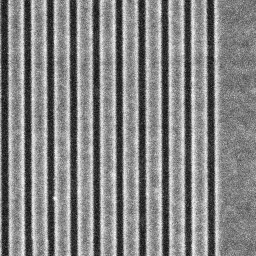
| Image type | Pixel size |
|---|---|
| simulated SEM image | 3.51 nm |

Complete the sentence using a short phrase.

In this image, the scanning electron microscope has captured parallel lines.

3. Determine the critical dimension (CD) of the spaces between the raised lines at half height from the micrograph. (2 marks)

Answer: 0.0294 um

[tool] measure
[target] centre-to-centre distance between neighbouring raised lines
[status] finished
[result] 80.5 nm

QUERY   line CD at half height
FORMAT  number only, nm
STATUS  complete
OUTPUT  49.2